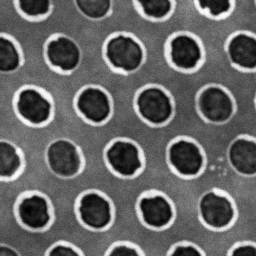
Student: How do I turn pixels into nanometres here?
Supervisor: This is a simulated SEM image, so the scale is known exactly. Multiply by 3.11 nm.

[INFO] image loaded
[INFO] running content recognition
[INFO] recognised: a regular array of holes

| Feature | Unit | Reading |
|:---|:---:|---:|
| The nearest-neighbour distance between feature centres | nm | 187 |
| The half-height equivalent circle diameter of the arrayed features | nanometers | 102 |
